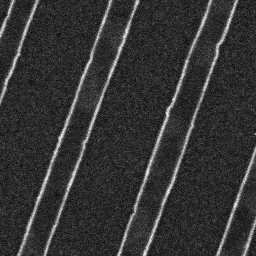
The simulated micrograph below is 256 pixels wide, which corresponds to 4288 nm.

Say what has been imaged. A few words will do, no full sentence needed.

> one or a few lines or trenches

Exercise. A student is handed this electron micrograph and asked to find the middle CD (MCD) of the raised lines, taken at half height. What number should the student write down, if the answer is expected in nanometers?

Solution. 429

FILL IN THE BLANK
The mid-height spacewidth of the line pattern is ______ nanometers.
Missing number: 1130